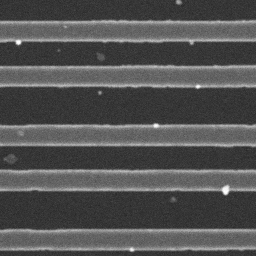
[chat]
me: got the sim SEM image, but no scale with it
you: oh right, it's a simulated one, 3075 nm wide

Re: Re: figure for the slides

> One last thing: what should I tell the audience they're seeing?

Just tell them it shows lines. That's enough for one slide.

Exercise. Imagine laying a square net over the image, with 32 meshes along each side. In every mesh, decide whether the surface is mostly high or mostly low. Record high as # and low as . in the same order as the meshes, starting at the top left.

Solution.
................................
................................
................................
################################
################################
................................
................................
................................
################################
################################
################################
................................
................................
................................
................................
................................
################################
################################
................................
................................
................................
################################
################################
################################
................................
................................
................................
................................
................................
################################
################################
................................